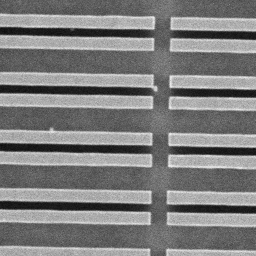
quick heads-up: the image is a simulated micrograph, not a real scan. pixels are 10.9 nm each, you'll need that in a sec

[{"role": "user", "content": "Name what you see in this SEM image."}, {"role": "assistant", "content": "groups of lines, slits or small figures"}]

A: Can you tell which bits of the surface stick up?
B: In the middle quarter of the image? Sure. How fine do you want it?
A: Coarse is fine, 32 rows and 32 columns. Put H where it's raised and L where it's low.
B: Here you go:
LLLLLLLLLLLLLLLLLLLLLLLLLLLLLLLL
LLLLLLLLLLLLLLLLLLLLLLLLLLLLLLLL
HHHLLLLLLLLLLLLLLLLLLLLLLLLLLLLL
HHHHHHHHHHHHHHHHHHHHHHLLLLLHHHHH
HHHHHHHHHHHHHHHHHHHHHHLLLLLHHHHH
LLLLLLLLHHHHHHHHHHHHHHLLLLLHHHHH
LLLLLLLLLLLLLLLLLLLLLLLLLLLLLLLL
LLLLLLLLLLLLLLLLLLLLLLLLLLLLLLLL
HHHHHHHHHHHHHHHHHHHHHHLLLLLHHHHH
HHHHHHHHHHHHHHHHHHHHHHLLLLHHHHHH
HHHHHHHHHHHHHHHHHHHHHHLLLLHHHHHH
LLLLLLLLLLLLLLLLLLLLLLLLLLLLLLLL
LLLLLLLLLLLLLLLLLLLLLLLLLLLLLLLL
LLLLLLLLLLLLLLLLLLLLLLLLLLLLLLLL
LLLLLLLLLLLLLLLLLLLLLLLLLLLLLLLL
LLLLLLLLLLLLLLLLLLLLLLLLLLLLLLLL
LLLLLLLLLLLLLLLLLLLLLLLLLLLLLLLL
HHHHHHHHHHHHHHHHHHHHHHLLLLHHHLLL
HHHHHHHHHHHHHHHHHHHHHHLLLLHHHHHH
HHHHHHHHHHHHHHHHHHHHHHLLLLHHHHHH
LLLLLLLLLLLLLLLLLLLLLLLLLLLLLLLL
LLLLLLLLLLLLLLLLLLLLLLLLLLLLLLLL
HHHHHHHHHHHHHHLLLLLLLLLLLLLLLLLL
HHHHHHHHHHHHHHHHHHHHHHLLLLHHHHHH
HHHHHHHHHHHHHHHHHHHHHHLLLLHHHHHH
LLLLLLLLLLLLLLLLLLLHHHLLLLHHHHHH
LLLLLLLLLLLLLLLLLLLLLLLLLLLLLLLL
LLLLLLLLLLLLLLLLLLLLLLLLLLLLLLLL
LLLLLLLLLLLLLLLLLLLLLLLLLLLLLLLL
LLLLLLLLLLLLLLLLLLLLLLLLLLLLLLLL
LLLLLLLLLLLLLLLLLLLLLLLLLLLLLLLL
LLLLLLLLLLLLLLLLLLLLLLLLLLLLLLLL